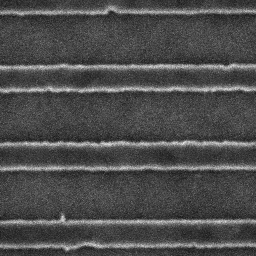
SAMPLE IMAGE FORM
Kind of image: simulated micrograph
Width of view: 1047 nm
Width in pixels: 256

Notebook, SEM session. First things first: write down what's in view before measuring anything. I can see one or a few lines or trenches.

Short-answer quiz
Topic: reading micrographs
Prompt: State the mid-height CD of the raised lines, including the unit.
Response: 104 nm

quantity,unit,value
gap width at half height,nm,214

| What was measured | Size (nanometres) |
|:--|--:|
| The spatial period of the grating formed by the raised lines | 318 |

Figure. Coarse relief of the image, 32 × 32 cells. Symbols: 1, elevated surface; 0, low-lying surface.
11111111111111111111111111111111
11111111111110011111111111111100
00000000000000000000000000000000
00000000000000000000000000000000
00000000000000000000000000000000
00000000000000000000000000000000
00000000000000000000000000000000
00000000000000000000000000000000
11111111111111111111111111111111
11111111111111111111111111111111
11111111111111111111111111111111
00000000000000000000000000000000
00000000000000000000000000000000
00000000000000000000000000000000
00000000000000000000000000000000
00000000000000000000000000000000
00000000000000000000000000000000
00000000000000000000000000000000
11111111111111111111111111111111
11111111111111111111111111111111
11111111111111111111111111111111
00000000000000000000000000000000
00000000000000000000000000000000
00000000000000000000000000000000
00000000000000000000000000000000
00000000000000000000000000000000
00000000000000000000000000000000
00000001000000000000000000000000
11111111111111111111111111111111
11111111111111111111111111111111
11111111111111111111111111111111
00000000000000000000000000000000